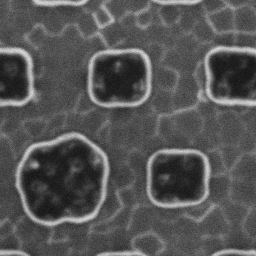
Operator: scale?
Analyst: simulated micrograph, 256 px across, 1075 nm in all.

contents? raised bodies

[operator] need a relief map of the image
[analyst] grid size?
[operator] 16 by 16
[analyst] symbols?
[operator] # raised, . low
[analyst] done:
................
................
................
##....###....###
##....###....###
##....###....###
#.....###......#
................
....#...........
..####....##....
.######..####...
.######..####...
.#####....###...
..####..........
................
................